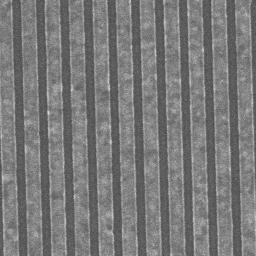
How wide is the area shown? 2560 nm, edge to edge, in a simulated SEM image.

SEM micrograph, parallel lines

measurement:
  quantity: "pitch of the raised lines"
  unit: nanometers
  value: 238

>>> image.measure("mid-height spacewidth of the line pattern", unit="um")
0.0963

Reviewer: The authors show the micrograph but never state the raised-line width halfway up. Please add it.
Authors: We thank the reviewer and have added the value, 0.145 microns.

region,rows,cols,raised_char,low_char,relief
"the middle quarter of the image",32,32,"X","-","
--XXX---XXX---XXX---XXX--XXXX--X
--XXX---XXX---XXX--XXXX--XXXX---
--XXX---XXX---XXX---XXX---XXX---
--XXX---XXX---XXX---XXX---XXX---
--XXX---XXX---XXX---XXX---XXX---
--XXX---XXX---XXX---XXX---XXX---
--XXX---XXX---XXX---XXX---XXX---
--XXX---XXX---XXX---XXX---XXX---
--XXX---XXX---XXX---XXX---XXX---
--XXX---XXX---XXX---XXX---XXX---
--XXX---XXX---XXX---XXX---XXX---
--XXX---XXX---XXX---XXX---XXX---
--XXX---XXX---XXX---XXX---XXX---
--XXXX--XXXX--XXX---XXX---XXX---
--XXXX--XXX---XXX---XXX---XXX---
--XXXX--XXXX--XXX---XXX---XXX---
--XXXX--XXXX--XXX---XXX---XXX---
--XXXX--XXXX--XXX---XXX---XXX---
--XXXX--XXXX--XXX---XXX---XXX---
--XXXX--XXXX--XXXX--XXX---XXX---
--XXXX--XXXX--XXXX--XXX---XXX---
--XXXX--XXXX--XXXX--XXX---XXX---
--XXXX--XXXX--XXXX--XXX---XXX---
--XXXX--XXXX--XXXX--XXXX--XXX---
--XXXX--XXXX--XXXX--XXX---XXX---
--XXXX--XXXX--XXXX--XXXX--XXXX--
--XXXX---XXX--XXXX--XXXX--XXXX--
---XXX---XXX--XXXX--XXXX--XXXX--
---XXX---XXX--XXXX--XXXX--XXXX--
---XXX--XXXX--XXXX--XXXX--XXXX--
---XXX--XXXX--XXXX--XXXX--XXXX--
---XXX--XXXX--XXXX--XXXX--XXXX--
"